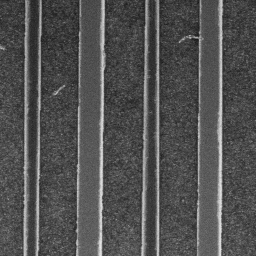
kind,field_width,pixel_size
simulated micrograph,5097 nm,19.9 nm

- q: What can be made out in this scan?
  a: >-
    lines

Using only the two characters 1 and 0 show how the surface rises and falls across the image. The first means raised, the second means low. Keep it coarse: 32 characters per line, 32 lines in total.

00011000001110000011000001110000
00011000001110000011000001110000
00011000001110000011000001110000
00011000001110000011000001110000
00011000001110000011000001110000
00011000001110000011000001110000
00011000001110000011000001110000
00011000001110000011000001110000
00011000001110000011000001110000
00011000001110000011000001110000
00011000001110000011000001110000
00011000001110000011000001110000
00011000001110000011000001110000
00011000001110000011000001110000
00011000001110000011000001110000
00011000001110000011000001110000
00011000001110000011000001110000
00011000001110000011000001110000
00011000001110000011000001110000
00011000001110000011000001110000
00011000001110000011000001110000
00011000001110000011000001110000
00011000001110000011000001110000
00011000001110000011000001110000
00011000001110000011000001110000
00011000001110000011000001100000
00011000001110000011000001100000
00011000001110000011000001100000
00011000001110000011000001100000
00011000001110000011000001100000
00011000001110000011000001110000
00011000001110000011000001110000